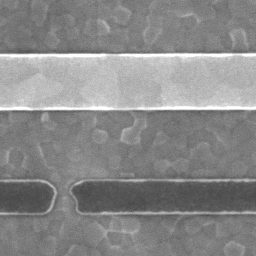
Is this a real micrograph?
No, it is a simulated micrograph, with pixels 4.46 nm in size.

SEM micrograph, one or a few lines or trenches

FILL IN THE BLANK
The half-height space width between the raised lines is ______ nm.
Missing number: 313